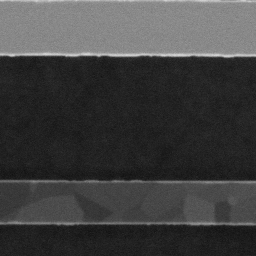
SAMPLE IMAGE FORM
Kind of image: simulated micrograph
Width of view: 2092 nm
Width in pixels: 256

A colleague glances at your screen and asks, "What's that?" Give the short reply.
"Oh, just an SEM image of lines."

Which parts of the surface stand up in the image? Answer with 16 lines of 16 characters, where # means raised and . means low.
################
################
################
.............##.
................
................
................
................
................
................
................
################
################
################
................
................